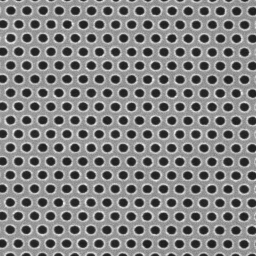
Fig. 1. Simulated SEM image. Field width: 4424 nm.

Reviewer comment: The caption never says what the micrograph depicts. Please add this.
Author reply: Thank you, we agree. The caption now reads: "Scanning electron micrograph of a regular array of holes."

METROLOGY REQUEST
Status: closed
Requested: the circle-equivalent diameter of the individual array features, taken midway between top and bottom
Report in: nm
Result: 164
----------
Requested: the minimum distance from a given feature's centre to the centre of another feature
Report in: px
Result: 15.8